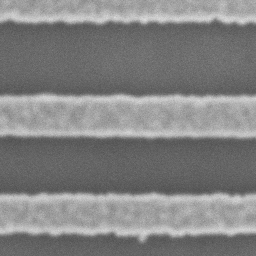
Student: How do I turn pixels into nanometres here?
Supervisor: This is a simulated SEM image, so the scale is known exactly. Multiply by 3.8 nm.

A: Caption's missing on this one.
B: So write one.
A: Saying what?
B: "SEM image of lines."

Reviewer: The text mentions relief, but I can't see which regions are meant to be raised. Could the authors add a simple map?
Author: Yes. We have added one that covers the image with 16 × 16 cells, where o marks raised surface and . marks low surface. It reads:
oooooooooooooooo
................
................
................
................
................
oooooooooooooooo
oooooooooooooooo
......o.ooo.oooo
................
................
................
oooooooooooooooo
oooooooooooooooo
o.oooooooooooooo
................